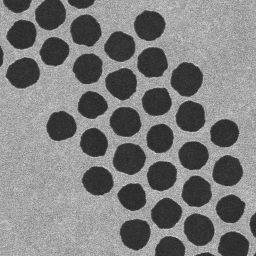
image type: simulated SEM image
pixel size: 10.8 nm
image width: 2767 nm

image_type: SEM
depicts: a regular array of holes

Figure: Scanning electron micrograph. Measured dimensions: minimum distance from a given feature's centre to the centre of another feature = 36.8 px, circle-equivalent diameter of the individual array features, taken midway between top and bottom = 0.323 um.